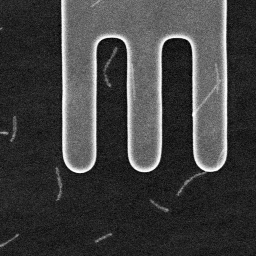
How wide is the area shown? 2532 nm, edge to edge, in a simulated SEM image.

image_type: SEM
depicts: groups of lines, slits or small figures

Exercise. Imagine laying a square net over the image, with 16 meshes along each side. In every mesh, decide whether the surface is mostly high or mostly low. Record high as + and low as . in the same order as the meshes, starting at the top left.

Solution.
....++++++++++..
....++++++++++..
....++..+++.++..
....++..++..++..
....++..++..++..
....++..++..++..
....++..++..++..
....++..++..++..
....++..++..++..
....++..++..++..
....++..++...+..
................
................
................
................
................